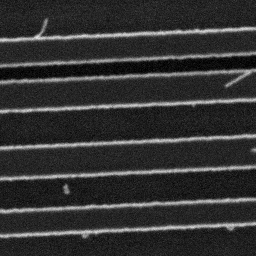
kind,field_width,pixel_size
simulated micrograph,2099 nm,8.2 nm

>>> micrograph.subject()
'lines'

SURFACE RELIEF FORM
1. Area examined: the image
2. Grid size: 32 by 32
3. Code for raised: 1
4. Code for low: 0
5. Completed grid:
00000000000000000000000000000000
00000000000000000000000000000000
00000000000000000000000000000000
00000000000000000000000000000000
00000000001111111111111111111111
11111111111111111111111111111111
11111111111111111111111111111111
11111111111111110000000000000000
00000000000000000000000000000000
00000000000000011111111111111111
11111111111111111111111111111111
11111111111111111111111111111111
11111111111111111111111111111111
11111111110000000000000000000000
00000000000000000000000000000000
00000000000000000000000000000000
00000000000000000000000000000000
00000000000000000000001111111111
01111111111111111111111111111111
11111111111111111111111111111111
11111111111111111111111111111111
11111111111111111111000000000000
00000000000000000000000000000000
00000000000000000000000000000000
00000000000000000000000000000000
00000000000000000001111111111111
11111111111111111111111111111111
11111111111111111111111111111111
11111111111111111111100000000000
11000000000000000000000000000000
00000000000000000000000000000000
00000000000000000000000000000000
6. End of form